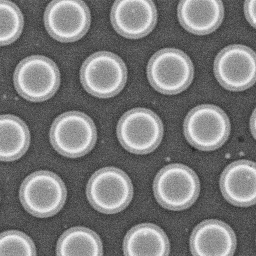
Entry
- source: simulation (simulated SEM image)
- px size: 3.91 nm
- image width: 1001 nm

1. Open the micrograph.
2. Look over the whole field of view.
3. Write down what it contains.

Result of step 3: an array of small figures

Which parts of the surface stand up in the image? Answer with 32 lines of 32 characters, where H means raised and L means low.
HHLLLLHHHHHLLLHHHHHLLLHHHHHHLLLH
HHHLLLHHHHHLLLHHHHHHLLHHHHHHLLLH
HHHLLLHHHHHLLLHHHHHHLLHHHHHHLLLH
HHHLLLHHHHHLLLHHHHHLLLLHHHHLLLLL
HHLLLLHHHHLLLLLHHHLLLLLLLLLLLLLL
HLLLLLLLLLLLLLLLLLLLLLLLLLLLLLLL
LLLLLLLLLLLLHHLLLLLLHHHLLLLHHHHH
LLLHHHLLLLLHHHHLLLLHHHHHLLLHHHHH
LLHHHHHLLLHHHHHHLLHHHHHHLLLHHHHH
LLHHHHHLLLHHHHHHLLHHHHHHLLLHHHHH
LLHHHHHLLLHHHHHHLLLHHHHHLLLLHHHH
LLHHHHHLLLLHHHHLLLLLHHHLLLLLLLLL
LLLHHHLLLLLLLLLLLLLLLLLLLLLLLLLL
LLLLLLLLLLLLLLLLLHLLLLLLHHHLLLLL
HHLLLLLHHHHLLLLHHHHHLLLHHHHHLLLH
HHHLLLLHHHHHLLLHHHHHLLLHHHHHHLLH
HHHHLLHHHHHHLLLHHHHHLLLHHHHHHLLH
HHHHLLHHHHHHLLLHHHHHLLLHHHHHLLLL
HHHHLLLHHHHHLLLLHHHHLLLLHHHLLLLL
HHHLLLLLHHLLLLLLLLLLLLLLLLLLLLLL
LLLLLLLLLLLLLLLLLLLLLLLLLLLLLHHH
LLLLHHLLLLLLHHHLLLLLHHHHLLLLHHHH
LLLHHHHHLLLHHHHHLLLHHHHHHLLHHHHH
LLLHHHHHLLLHHHHHHLLHHHHHHLLLHHHH
LLHHHHHHLLLHHHHHHLLHHHHHHLLLHHHH
LLLHHHHHLLLHHHHHLLLLHHHHLLLLLHHH
LLLHHHHLLLLLLHHLLLLLLLLLLLLLLLLL
LLLLLLLLLLLLLLLLLLLLLLLLLLHLLLLL
LLLLLLLLLHHLLLLLLHHHLLLLHHHHHLLL
HHHHLLLLHHHHLLLLHHHHHLLLHHHHHLLL
HHHHLLLHHHHHHLLHHHHHHLLLHHHHHHLL
HHHHLLLHHHHHHLLHHHHHHLLLHHHHHLLL